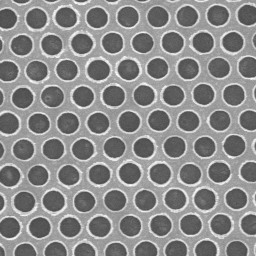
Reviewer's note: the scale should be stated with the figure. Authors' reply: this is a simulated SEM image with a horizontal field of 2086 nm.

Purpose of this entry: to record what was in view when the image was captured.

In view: a regular array of holes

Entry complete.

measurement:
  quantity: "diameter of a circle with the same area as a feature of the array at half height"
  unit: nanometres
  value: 176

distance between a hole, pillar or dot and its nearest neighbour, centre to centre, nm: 239